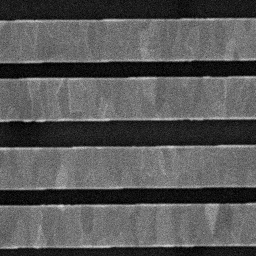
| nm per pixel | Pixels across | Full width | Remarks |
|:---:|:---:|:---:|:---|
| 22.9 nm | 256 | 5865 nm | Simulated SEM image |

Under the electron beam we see lines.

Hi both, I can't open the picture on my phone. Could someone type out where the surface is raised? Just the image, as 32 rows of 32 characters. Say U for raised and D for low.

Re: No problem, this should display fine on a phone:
DDDDDDDDDDDDDDDDDDDDDDDDDDDDDDDD
DDDDDDDDDDDDDDDDDDDDDDDDDDDDDDDD
DDDDDDDDDDDDDUUUUUUUUUUUUUUUUUUU
UUUUUUUUUUUUUUUUUUUUUUUUUUUUUUUU
UUUUUUUUUUUUUUUUUUUUUUUUUUUUUUUU
UUUUUUUUUUUUUUUUUUUUUUUUUUUUUUUU
UUUUUUUUUUUUUUUUUUUUUUUUUUUUUUUU
UUUUUUUUUUUUUUUUUUUUUUUUDDDDDDDD
DDDDDDDDDDDDDDDDDDDDDDDDDDDDDDDD
DDDDDDDDDDDDDDDDDDDDDDDDDDDDDDDD
UUUUUUUUUUUUUUUUUUUUUUUUUUUUUUUU
UUUUUUUUUUUUUUUUUUUUUUUUUUUUUUUU
UUUUUUUUUUUUUUUUUUUUUUUUUUUUUUUU
UUUUUUUUUUUUUUUUUUUUUUUUUUUUUUUU
UUUUUUUUUUUUUUUUUUUUUUUUUUUUUUUU
DDDDDDDDDDDDDDDDDDDDDDDDDDDDDDDD
DDDDDDDDDDDDDDDDDDDDDDDDDDDDDDDD
DDDDDDDDDDDDDDDDDDDDDDDDDDDDDDDD
DDDDDDDDDUUUUUUUUUUUUUUUUUUUUUUU
UUUUUUUUUUUUUUUUUUUUUUUUUUUUUUUU
UUUUUUUUUUUUUUUUUUUUUUUUUUUUUUUU
UUUUUUUUUUUUUUUUUUUUUUUUUUUUUUUU
UUUUUUUUUUUUUUUUUUUUUUUUUUUUUUUU
UUUUUUUUUUUUUUUUDDDDDDDDDDDDDDDD
DDDDDDDDDDDDDDDDDDDDDDDDDDDDDDDD
DDDDDDDDDDDDDDDDDDDDDDDDDDDDUDUU
UUUUUUUUUUUUUUUUUUUUUUUUUUUUUUUU
UUUUUUUUUUUUUUUUUUUUUUUUUUUUUUUU
UUUUUUUUUUUUUUUUUUUUUUUUUUUUUUUU
UUUUUUUUUUUUUUUUUUUUUUUUUUUUUUUU
UUUUUUUUUUUUUUUUUUUUUUUUUUUUUUUU
DDDDDDDDDDDDDDDDDDDDDDDDDDDDDDDD